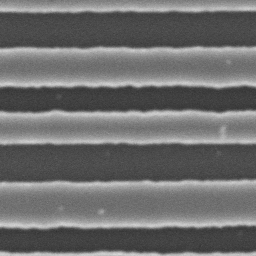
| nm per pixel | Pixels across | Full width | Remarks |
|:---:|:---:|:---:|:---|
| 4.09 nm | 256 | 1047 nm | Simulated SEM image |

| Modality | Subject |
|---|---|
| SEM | lines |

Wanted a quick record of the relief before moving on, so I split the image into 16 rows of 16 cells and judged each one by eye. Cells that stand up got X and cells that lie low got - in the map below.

XXXXXXXXXXXXXXXX
----------------
----------------
XXXXXXXXXXXXXXXX
XXXXXXXXXXXXXXXX
----------------
----------------
XXXXXXXXXXXXXXXX
XXXXXXXXXXXXXXXX
----------------
----------------
XXXXXXXXXXXXXXXX
XXXXXXXXXXXXXXXX
XXXXXXXXXXXXXXXX
----------------
----------------